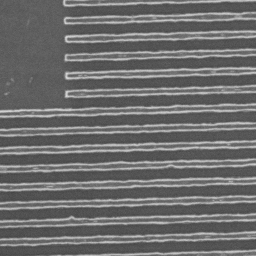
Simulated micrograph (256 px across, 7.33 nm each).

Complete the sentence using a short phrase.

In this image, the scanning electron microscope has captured parallel lines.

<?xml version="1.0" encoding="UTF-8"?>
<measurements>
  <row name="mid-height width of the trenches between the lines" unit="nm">94.4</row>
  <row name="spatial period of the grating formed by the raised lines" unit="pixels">18.3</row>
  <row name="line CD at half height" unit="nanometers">41.2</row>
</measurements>